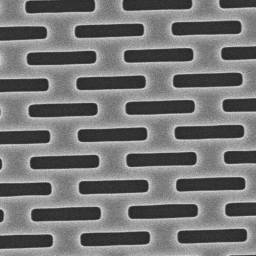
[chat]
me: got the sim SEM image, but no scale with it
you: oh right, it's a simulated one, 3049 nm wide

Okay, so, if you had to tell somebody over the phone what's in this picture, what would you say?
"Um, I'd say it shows groups of lines, slits or small figures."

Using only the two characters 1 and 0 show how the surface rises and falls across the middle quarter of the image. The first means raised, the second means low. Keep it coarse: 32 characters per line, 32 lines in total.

11111111111111111111111111111111
11111111111111111111111111111111
11111111111111111111111111111000
11110000000000000000111111100000
11100000000000000000011111100000
11100000000000000000111111100000
11110001111111111111111111111111
11111111111111111111111111111111
11111111111111111111111111111111
11111111111111110000000000000000
00000000111111100000000000000000
00000000011111100000000000000000
00000000111111110000000000000001
11111111111111111111111111111111
11111111111111111111111111111111
11111111111111111111111111111000
11110000000000000000011111110000
11100000000000000000011111100000
11100000000000000000011111110000
11110000000000011111111111111111
11111111111111111111111111111111
11111111111111111111111111111111
11111111111111110000000000000000
00000000011111100000000000000000
00000000011111110000000000000000
00000000011111110000000000000000
11111111111111111111111111111111
11111111111111111111111111111111
11111111111111111111111111111000
11110000000000000000011111110000
11110000000000000000011111110000
11110000000000000000011111110000